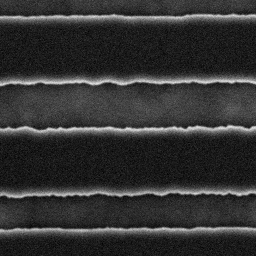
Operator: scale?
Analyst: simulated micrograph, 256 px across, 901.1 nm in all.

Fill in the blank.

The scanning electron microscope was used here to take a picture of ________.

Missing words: lines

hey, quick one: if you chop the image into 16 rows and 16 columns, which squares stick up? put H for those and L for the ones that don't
LLLLLLLLLLLLLLLL
HHHHHHHHHHHHHHHH
HHHHHHHHHHHHHHHH
HHHHHHHHHHHHHHHH
HHHHHHHHHHHHHHHH
LLLLLLLLLLLLLLLL
LLLLLLLLLLLLLLLL
LLLLLLLLLLLLLLLL
HHHHHHHHHHHHHHHH
HHHHHHHHHHHHHHHH
HHHHHHHHHHHHHHHH
HHHHHHHHHHHHHHHH
LLLLLLLLLLLLLLLL
LLLLLLLLLLLLLLLL
HHHHHHHHHHHHHHHH
HHHHHHHHHHHHHHHH